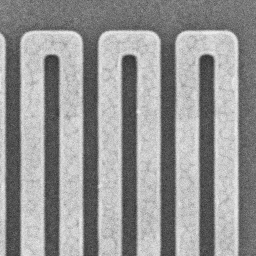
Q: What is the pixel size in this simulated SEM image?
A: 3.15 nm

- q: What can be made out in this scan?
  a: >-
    groups of lines, slits or small figures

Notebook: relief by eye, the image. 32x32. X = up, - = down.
--------------------------------
--------------------------------
--------------------------------
--------------------------------
---XXXXXXX---XXXXXX----XXXXXX---
X--XXXXXXX--XXXXXXXX--XXXXXXXX--
X--XXXXXXX--XXXXXXXX--XXXXXXXX--
X--XX--XXX--XXX--XXX--XXX--XXX--
---XX---XX--XXX--XXX--XXX--XXX--
---XX---XX--XXX--XXX--XXX--XXX--
---XX---XX--XXX--XXX--XXX--XXX--
---XX---XX--XXX--XXX--XXX--XXX--
X--XX---XX--XXX--XXX--XXX--XXX--
X--XX---XX--XXX--XXX--XXX--XXX--
X--XX---XX--XXX--XXX--XXX--XXX--
X--XX---XX--XXX--XXX--XXX--XXX--
X--XX---XX--XXX--XXX--XXX--XXX--
X--XX---XX--XXX--XXX--XXX--XXX--
X--XX---XX--XXX--XXX--XXX--XXX--
X--XX---XX--XXX--XXX--XXX--XXX--
X--XX---XX--XXX--XXX--XXX--XXX--
X--XX---XX--XXX--XXX--XXX--XXX--
X--XX---XX--XXX--XXX--XXX--XXX--
X--XX---XX--XXX--XXX--XXX--XXX--
X--XX---XX--XXX--XXX--XXX--XXX--
X--XX---XX--XXX--XXX--XXX--XXX--
X--XX---XX--XXX--XXX--XXX--XXX--
X--XX---XX--XXX--XXX--XXX--XXX--
X--XX---XX--XXX--XXX--XXX--XXX--
X--XX---XX--XXX--XXX--XXX--XXX--
X--XX---XX--XXX--XXX--XXX--XXX--
X--XX---XX--XXX--XXX--XXX--XXX--